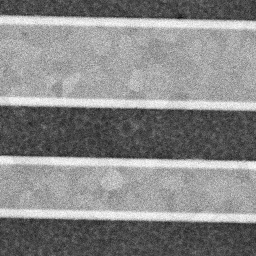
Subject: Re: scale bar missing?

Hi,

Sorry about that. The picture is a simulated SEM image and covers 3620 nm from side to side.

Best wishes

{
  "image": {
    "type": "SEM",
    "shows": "one or a few lines or trenches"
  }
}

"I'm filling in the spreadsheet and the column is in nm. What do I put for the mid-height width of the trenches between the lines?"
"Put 854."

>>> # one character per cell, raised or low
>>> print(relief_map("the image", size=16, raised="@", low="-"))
----------------
@@@@@@@@@@------
@@@@@@@@@@@@@@@@
@@@@@@@@@@@@@@@@
@@@@@@@@@@@@@@@@
@@@@@@@@@@@@@@@@
-----------@@@@@
----------------
----------------
----------------
@@@@@@@@@@@@@@@@
@@@@@@@@@@@@@@@@
@@@@@@@@@@@@@@@@
-----------@@@@@
----------------
----------------